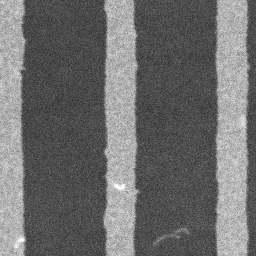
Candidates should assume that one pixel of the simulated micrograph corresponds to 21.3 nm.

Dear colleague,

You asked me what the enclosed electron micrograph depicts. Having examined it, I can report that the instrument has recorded one or a few lines or trenches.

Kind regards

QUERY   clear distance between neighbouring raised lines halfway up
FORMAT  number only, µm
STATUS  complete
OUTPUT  1.8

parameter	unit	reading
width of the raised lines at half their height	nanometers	592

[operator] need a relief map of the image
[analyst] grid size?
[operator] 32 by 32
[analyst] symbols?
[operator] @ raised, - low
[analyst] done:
@@@----------@@@@----------@@@@-
@@@----------@@@@----------@@@@-
@@@-----------@@@----------@@@@-
@@@-----------@@@----------@@@@-
@@@-----------@@@----------@@@@-
@@@-----------@@@----------@@@@-
@@@----------@@@@----------@@@@-
@@@----------@@@@----------@@@@-
@@@----------@@@@----------@@@@-
@@-----------@@@@----------@@@@-
@@@----------@@@@----------@@@@-
@@-----------@@@@----------@@@@-
@@@----------@@@@----------@@@@-
@@-----------@@@@----------@@@@-
@@@----------@@@@----------@@@@-
@@@----------@@@@----------@@@@-
@@------------@@@----------@@@@-
@@@-----------@@@----------@@@@-
@@@----------@@@@----------@@@@-
@@@----------@@@@----------@@@@-
@@@-----------@@@----------@@@@-
@@@----------@@@@----------@@@@-
@@@----------@@@@----------@@@@-
@@@----------@@@@----------@@@@-
@@@----------@@@@----------@@@@-
@@@----------@@@@----------@@@@-
@@@----------@@@@----------@@@@-
@@@----------@@@@----------@@@@-
@@@----------@@@@----------@@@@-
@@@----------@@@@----------@@@@-
@@@----------@@@@----------@@@@-
@@@----------@@@@----------@@@@-